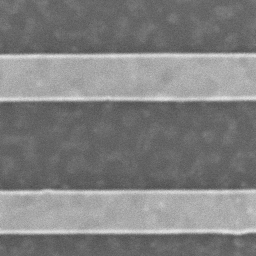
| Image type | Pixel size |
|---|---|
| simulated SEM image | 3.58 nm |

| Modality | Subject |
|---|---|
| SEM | one or a few lines or trenches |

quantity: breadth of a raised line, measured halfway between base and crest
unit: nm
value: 153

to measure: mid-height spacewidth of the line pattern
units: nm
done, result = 328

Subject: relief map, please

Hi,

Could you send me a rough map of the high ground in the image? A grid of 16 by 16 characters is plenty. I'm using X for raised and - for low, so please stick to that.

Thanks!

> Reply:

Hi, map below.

----------------
----------------
----------------
XXXXXXXXXXXXXXXX
XXXXXXXXXXXXXXXX
XXXXXXXXXXXXXXXX
----------------
----------------
----------------
----------------
----------------
----------------
XXXXXXXXXXXXXXXX
XXXXXXXXXXXXXXXX
XXXXX----XX--XXX
----------------